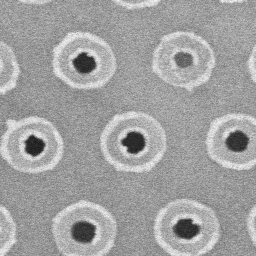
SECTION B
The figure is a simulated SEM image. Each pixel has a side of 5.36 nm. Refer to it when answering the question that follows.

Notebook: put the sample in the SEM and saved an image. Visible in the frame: ring-shaped raised bodies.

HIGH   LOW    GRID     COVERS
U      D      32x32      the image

DDDDDDDDDDDDDDDUUUUUDDDDDDDDDDDD
DDDDDDDDDDDDDDDDDDDDDDDDDDDDDDDD
DDDDDDDDDDDDDDDDDDDDDDDDDDDDDDDD
DDDDDDDDDDDDDDDDDDDDDDDDDDDDDDDD
DDDDDDDDUUUUDDDDDDDDDUDDDDDDDDDD
DDDDDDDUUUUUUDDDDDDDDDDDDDDDDDDD
UDDDDDDUUUUUUUDDDDDDDDDDDDDDDDDD
UUDDDDDUUDDDUUDDDDDDDDDDDDDDDDDU
UUDDDDDUUDDDUUDDDDDDDDDDDDDDDDDU
UUDDDDDUUUUUUUDDDDDDDDDDDDDDDDDU
UUDDDDDDUUUUUDDDDDDDDDDDDDDDDDDD
UDDDDDDDDDDDDDDDDDDDDDDDDDDDDDDD
DDDDDDDDDDDDDDDDDDDDDDDDDDDDDDDD
DDDDDDDDDDDDDDDDDDDDDDDDDDDDDDDD
DDDDDDDDDDDDDDDUUUDDDDDDDDDDDUUD
DUUUUUDDDDDDDDUUUUUUDDDDDDUUUUUU
DUUUUUUDDDDDDUUUDUUUDDDDDDUUUDUU
UUUDDUUUDDDDDUUDDDUUUDDDDDUUDDDU
UUUDDUUUDDDDDUUUDDUUUDDDDDUUUDDU
UUUUUUUUDDDDDUUUUUUUDDDDDDDUUUUU
DUUUUUUDDDDDDDUUUUUDDDDDDDDDUUUU
DDDDDDDDDDDDDDDDDUDDDDDDDDDDDDDD
DDDDDDDDDDDDDDDDDDDDDDDDDDDDDDDD
DDDDDDDDDDDDDDDDDDDDDDDDDDDDDDDD
DDDDDDDDDDDDDDDDDDDDDDDDDDDDDDDD
DDDDDDDDDUUUDDDDDDDDDUUUUDDDDDDD
UDDDDDDDUUUUUDDDDDDDUUUUUUDDDDDU
UDDDDDDUUUUUUUDDDDDDUUUDUUUDDDDU
UUDDDDDUUDDDUUDDDDDUUUDDDUUDDDDU
UUDDDDDUUDDDUUDDDDDUUUDDUUUDDDDU
UUDDDDDUUUUUUUDDDDDDUUUUUUUDDDDD
UDDDDDDDUUUUUDDDDDDDDUUUUUDDDDDD